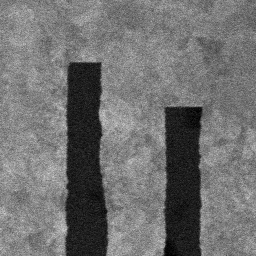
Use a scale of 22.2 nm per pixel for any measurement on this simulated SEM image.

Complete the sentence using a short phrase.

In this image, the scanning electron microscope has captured one or a few lines or trenches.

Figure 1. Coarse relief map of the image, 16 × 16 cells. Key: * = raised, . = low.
****************
****************
****************
****************
****..**********
****..**********
****..**********
****..****...***
****..****...***
****..****...***
****..****...***
****..****...***
****...***...***
****...***...***
****...***...***
****...***...***